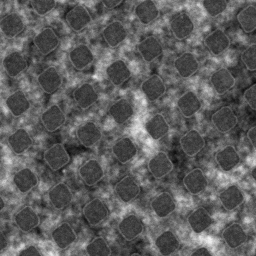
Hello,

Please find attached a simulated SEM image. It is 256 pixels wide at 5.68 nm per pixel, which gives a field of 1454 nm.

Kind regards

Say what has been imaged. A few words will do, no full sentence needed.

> a regular array of raised bodies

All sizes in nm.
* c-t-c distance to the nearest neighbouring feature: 219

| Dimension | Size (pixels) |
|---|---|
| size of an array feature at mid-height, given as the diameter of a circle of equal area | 23.9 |